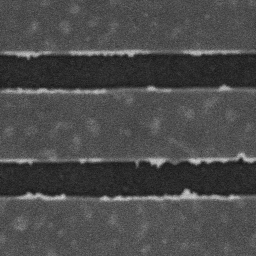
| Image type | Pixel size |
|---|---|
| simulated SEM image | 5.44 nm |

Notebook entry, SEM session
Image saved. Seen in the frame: one or a few lines or trenches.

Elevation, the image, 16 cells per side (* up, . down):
****************
****************
****************
.*..............
................
.........*..***.
****************
****************
****************
****************
................
................
****************
****************
****************
****************